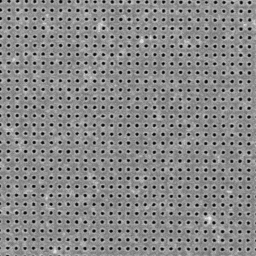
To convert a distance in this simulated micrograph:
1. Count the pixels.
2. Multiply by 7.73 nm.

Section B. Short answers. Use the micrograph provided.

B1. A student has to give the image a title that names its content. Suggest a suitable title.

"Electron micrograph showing a regular array of holes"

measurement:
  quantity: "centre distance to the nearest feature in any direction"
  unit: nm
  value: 64.9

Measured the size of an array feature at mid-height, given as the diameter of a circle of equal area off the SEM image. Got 26.2 nm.